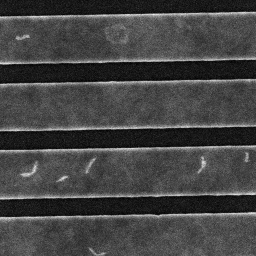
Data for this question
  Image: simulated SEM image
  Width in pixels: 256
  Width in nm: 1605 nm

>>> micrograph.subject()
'one or a few lines or trenches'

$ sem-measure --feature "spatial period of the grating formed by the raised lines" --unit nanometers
421